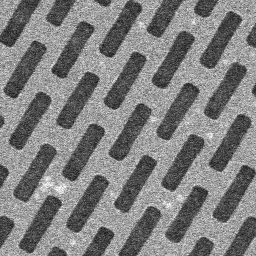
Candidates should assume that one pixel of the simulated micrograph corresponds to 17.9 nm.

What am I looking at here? a regular array of holes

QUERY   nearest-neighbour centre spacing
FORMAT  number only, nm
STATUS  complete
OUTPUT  918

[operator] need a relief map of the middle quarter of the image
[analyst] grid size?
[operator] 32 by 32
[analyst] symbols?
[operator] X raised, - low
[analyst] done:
--XXXXXXXXXXXXX-----XXXX-----XXX
--XXXXXXXXXXXX-----XXXX-----XXXX
-XXXX---XXXXXX-----XXX------XXXX
XXXX-----XXXX-----XXXX-----XXXXX
XXXX-----XXXX-----XXXX-----XXXXX
XXX-----XXXX-----XXXXXX---XXXX--
XX------XXX------XXXXXXXXXXXX---
XX-----XXXX-----XXXXXXXXXXXX----
X-----XXXX-----XXXXXXXXXXXXX----
------XXXX-----XXXXXXXXXXXX-----
-----XXXXXX---XXXX---XXXXXX-----
-----XXXXXXX-XXXX-----XXXX-----X
----XXXXXXXXXXXXX-----XXX------X
---XXXXXXXXXXXXX-----XXXX-----XX
---XXXXXXXXXXXXX-----XXX-----XXX
--XXXX---XXXXXX-----XXXX-----XXX
XXXXX-----XXXX-----XXXX-----XXXX
XXXXX-----XXXX-----XXXX----XXXXX
XXXX------XXX-----XXXXXX---XXXX-
XXXX-----XXX------XXXXXXXXXXXX--
XXX-----XXXX-----XXXXXXXXXXXXX--
XX------XXX-----XXXXXXXXXXXXX---
XX-----XXXX-----XXXXXXXXXXXX----
X-----XXXXXX---XXXX---XXXXXX----
X-----XXXXXXXXXXXX-----XXXX-----
-----XXXXXXXXXXXXX-----XXXX-----
-----XXXXXXXXXXXXX----XXXX-----X
----XXXXXXXXXXXXX-----XXX-----XX
---XXXX----XXXXX-----XXXX-----XX
XXXXXXX----XXXXX-----XXX-----XXX
XXXXXX-----XXXX-----XXXX-----XXX
XXXXX------XXX-----XXXXXXX--XXXX